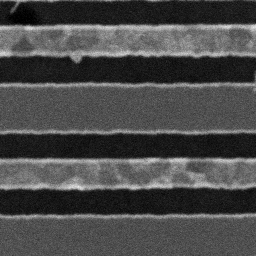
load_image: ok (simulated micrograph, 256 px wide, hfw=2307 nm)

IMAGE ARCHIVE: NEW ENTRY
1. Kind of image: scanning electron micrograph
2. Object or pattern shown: lines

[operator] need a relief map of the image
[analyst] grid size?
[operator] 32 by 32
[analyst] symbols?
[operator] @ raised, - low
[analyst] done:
--------------------------------
--------------------------------
--------------------------------
@@@@@@@@@@@@@@@@@@@@@@@@@@@@@@@@
@@@@@@@@@@@@@@@@@@@@@@@@@@@@@@@@
@@@@@@@@@@@@@@@@@@@@@@@@@@@@@@@@
@@@@@@@@@@@@@@@@@@@@@@@@@@@@@@@@
---------@----------------------
--------------------------------
--------------------------------
---------@@@--@-------@----@@@@@
@@@@@@@@@@@@@@@@@@@@@@@@@@@@@@@@
@@@@@@@@@@@@@@@@@@@@@@@@@@@@@@@@
@@@@@@@@@@@@@@@@@@@@@@@@@@@@@@@@
@@@@@@@@@@@@@@@@@@@@@@@@@@@@@@@@
@@@@@@@@@@@@@@@@@@@@@@@@@@@@@@@@
@--@@@@@@@@@@@-@@@@@-@@@@@@@----
--------------------------------
--------------------------------
--------------------------------
@@@@@@@@@@@@@@@@@@@@@@@@@@@@@@@@
@@@@@@@@@@@@@@@@@@@@@@@@@@@@@@@@
@@@@@@@@@@@@@@@@@@@@@@@@@@@@@@@@
----------@@--------------------
--------------------------------
--------------------------------
--------------------------------
@@@@@@@@@@@@@@@@@@@@@@@@@@@@@@@@
@@@@@@@@@@@@@@@@@@@@@@@@@@@@@@@@
@@@@@@@@@@@@@@@@@@@@@@@@@@@@@@@@
@@@@@@@@@@@@@@@@@@@@@@@@@@@@@@@@
@@@@@@@@@@@@@@@@@@@@@@@@@@@@@@@@